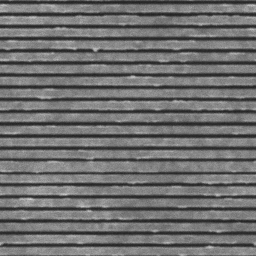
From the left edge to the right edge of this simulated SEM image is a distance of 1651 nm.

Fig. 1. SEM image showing parallel lines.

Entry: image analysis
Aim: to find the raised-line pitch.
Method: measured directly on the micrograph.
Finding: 78.3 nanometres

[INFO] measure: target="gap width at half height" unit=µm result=0.0226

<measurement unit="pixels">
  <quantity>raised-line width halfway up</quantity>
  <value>8.62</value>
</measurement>